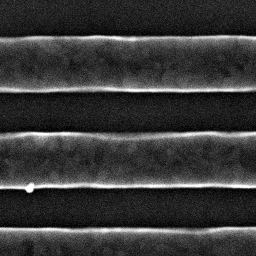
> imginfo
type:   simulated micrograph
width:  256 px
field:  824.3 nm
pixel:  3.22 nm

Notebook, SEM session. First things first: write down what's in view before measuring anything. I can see wiring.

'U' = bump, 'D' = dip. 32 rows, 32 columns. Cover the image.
DDDDDDDDDDDDDDDDDDDDDDDDDDDDDDDD
DDDDDDDDDDDDDDDDDDDDDDDDDDDDDDDD
DDDDDDDDDDDDDDDDDDDDDDDDDDDDDDDD
DDDDDDDDDDDDDDDDDDDDDDDDDDDDDDDD
DDDDDDDDDDDDDDDDDDDDDDDDDDDDDDDD
UUUUUUUUUUUUUUUUUUUUUUUUUUUUUUUU
UUUUUUUUUUUUUUUUUUUUUUUUUUUUUUUU
UUUUUUUUUUUUUUUUUUUUUUUUUUUUUUUU
UUUUUUUUUUUUUUUUUUUUUUUUUUUUUUUU
UUUUUUUUUUUUUUUUUUUUUUUUUUUUUUUU
UUUUUUUUUUUUUUUUUUUUUUUUUUUUUUUU
DDDDDDDDDDDDDDDDDDDDDDDDDDDDDDDD
DDDDDDDDDDDDDDDDDDDDDDDDDDDDDDDD
DDDDDDDDDDDDDDDDDDDDDDDDDDDDDDDD
DDDDDDDDDDDDDDDDDDDDDDDDDDDDDDDD
DDDDDDDDDDDDDDDDDDDDDDDDDDDDDDDD
DDDDDDDDDDDDDDDDDDDDDDDDDDDDDDDD
UUUUUUUUUUUUUUUUUUUUUUUUUUUUUUUU
UUUUUUUUUUUUUUUUUUUUUUUUUUUUUUUU
UUUUUUUUUUUUUUUUUUUUUUUUUUUUUUUU
UUUUUUUUUUUUUUUUUUUUUUUUUUUUUUUU
UUUUUUUUUUUUUUUUUUUUUUUUUUUUUUUU
UUUUUUUUUUUUUUUUUUUUUUUUUUUUUUUU
DDUUUDDDDDDDDDDDDDDDDDDDDDDDDDDD
DDDDDDDDDDDDDDDDDDDDDDDDDDDDDDDD
DDDDDDDDDDDDDDDDDDDDDDDDDDDDDDDD
DDDDDDDDDDDDDDDDDDDDDDDDDDDDDDDD
DDDDDDDDDDDDDDDDDDDDDDDDDDDDDDDD
DDDDDDDDDDDDDDDDDDDDDDDDDDDDDDDD
UUUUUUUUUUUUUUUUUUUUUUUUUUUUUUUU
UUUUUUUUUUUUUUUUUUUUUUUUUUUUUUUU
UUUUUUUUUUUUUUUUUUUUUUUUUUUUUUUU